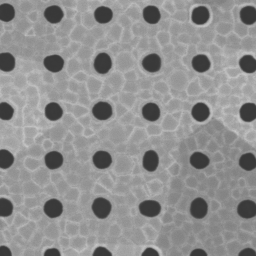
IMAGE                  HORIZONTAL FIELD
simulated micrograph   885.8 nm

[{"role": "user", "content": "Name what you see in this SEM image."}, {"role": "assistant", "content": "a regular array of holes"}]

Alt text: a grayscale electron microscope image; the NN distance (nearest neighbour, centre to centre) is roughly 167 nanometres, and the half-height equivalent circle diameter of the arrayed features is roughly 61.4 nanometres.